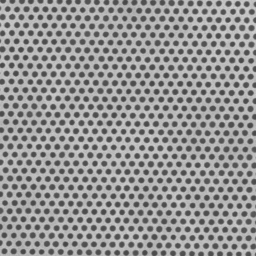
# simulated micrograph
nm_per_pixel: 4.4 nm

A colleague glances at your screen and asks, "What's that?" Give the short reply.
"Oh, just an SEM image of a regular array of holes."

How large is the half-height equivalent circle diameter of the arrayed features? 25.8 nm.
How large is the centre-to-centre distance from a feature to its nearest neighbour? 39.1 nm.